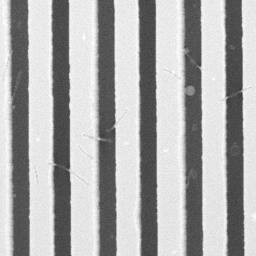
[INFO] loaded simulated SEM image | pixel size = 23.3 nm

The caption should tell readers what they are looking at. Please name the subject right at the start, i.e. lines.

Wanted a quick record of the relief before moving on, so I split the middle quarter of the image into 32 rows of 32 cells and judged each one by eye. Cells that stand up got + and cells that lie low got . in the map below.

.+++++++.....++++++....+++++++..
.+++++++.....++++++....+++++++..
.+++++++.....++++++....+++++++..
.+++++++.....++++++....+++++++..
.+++++++.....++++++....+++++++..
..++++++.....++++++....+++++++..
.+++++++.....++++++....+++++++..
.+++++++.....++++++....+++++++..
..++++++.....++++++....+++++++..
.+++++++.....++++++....+++++++..
.+++++++.....++++++....+++++++..
.+++++++.....++++++....+++++++..
..++++++.....++++++....+++++++..
..++++++.....++++++....+++++++..
..++++++.....++++++....+++++++..
..++++++.....++++++....+++++++..
..++++++.....++++++....+++++++..
..++++++.....++++++....+++++++..
..+++++++....++++++....+++++++..
..++++++.....++++++....+++++++..
..++++++.....++++++....+++++++..
..++++++.....++++++....+++++++..
..++++++.....++++++....+++++++..
..++++++.....++++++....+++++++..
..++++++.....++++++....+++++++..
..++++++.....++++++....+++++++..
.+++++++.....++++++....+++++++..
..++++++.....++++++....+++++++..
..++++++.....++++++....+++++++..
..++++++.....++++++....+++++++..
..++++++.....++++++....+++++++..
..++++++.....++++++....+++++++..